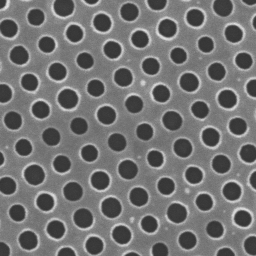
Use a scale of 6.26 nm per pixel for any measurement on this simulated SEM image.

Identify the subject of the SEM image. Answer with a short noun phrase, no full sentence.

a regular array of holes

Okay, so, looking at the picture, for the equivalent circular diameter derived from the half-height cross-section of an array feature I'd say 114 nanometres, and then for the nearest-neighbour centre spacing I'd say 182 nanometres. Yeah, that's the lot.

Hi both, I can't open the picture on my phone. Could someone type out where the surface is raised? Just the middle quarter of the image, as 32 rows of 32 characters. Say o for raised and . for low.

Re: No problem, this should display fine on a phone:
oooo...oooooooooooo.....oooooooo
.oooooooooooo...oooo....oooooooo
.oooooooooooo....oooo..ooooooo..
oooooooooooo.....oooooooooooo...
oooooo...oooo....oooooooooooo...
oooooo....oooo..ooooooo..oooo...
..oooo....oooooooooooo....oooo..
...ooo....oooooooooooo.....ooooo
....oooooooooooo...ooo....oooooo
....ooooooooooo.....ooo..ooooooo
...ooooooo.oooo.....oooooooooooo
ooooooooo....ooo...ooooooooooooo
oooooooo.....oooooooooooo....ooo
ooo.oooo.....oooooooooooo.....oo
oo....ooo...ooooooooooooo.....oo
o.....oooooooooooo....ooo....ooo
oo....oooooooooooo....oooo..oooo
ooo..ooooooo..oooo....oooooooooo
ooooooooooo....oooo...oooooooooo
ooooooooooo.....oooooooooooo....
ooooo..oooo.....ooooooooooo.....
oooo....oooo...oooooooooooo.....
oooo....ooooooooooooo....ooo....
.oooo...ooooooooooooo....ooooooo
..oooo.ooooooo....ooo....ooooooo
..oooooooooooo....oooo..oooooooo
.ooooooooooooo.....oooooooooooo.
ooooooo....ooo....oooooooooooo..
ooooooo....oooo..ooooooo..oooo..
o..oooo....ooooooooooooo...oooo.
....ooo....oooooooooooo.....oooo
.....ooo..ooooooo...oooo....oooo